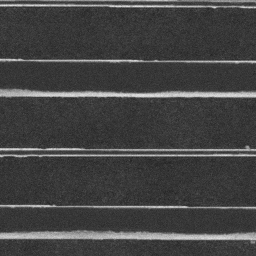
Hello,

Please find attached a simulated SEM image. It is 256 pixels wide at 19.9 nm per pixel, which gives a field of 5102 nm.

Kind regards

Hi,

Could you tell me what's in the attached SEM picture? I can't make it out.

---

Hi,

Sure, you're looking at lines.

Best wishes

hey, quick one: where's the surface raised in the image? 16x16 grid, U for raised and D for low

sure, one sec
DDDDDDDDDDDDDDDD
DDDDDDDDDDDDDDDD
DDDDDDDDDDDDDDDD
DDDDDDDDDDDDDDDD
UUUUUUUUUUUUUUUU
UUUUUUUUUUUUUUUU
DDDDDDDDDDDDDDDD
DDDDDDDDDDDDDDDD
DDDDDDDDDDDDDDDD
DDDDDDDDDDDDDDDD
DDDDDDDDDDDDDDDD
DDDDDDDDDDDDDDDD
DDDDDDDDDDDDDDDD
UUUUUUUUUUUUUUUU
UUUUUUUUUUUUUUUU
DDDDDDDDDDDDDDDD